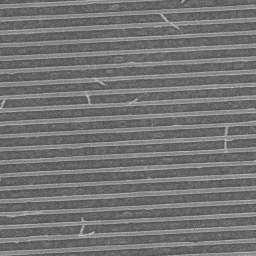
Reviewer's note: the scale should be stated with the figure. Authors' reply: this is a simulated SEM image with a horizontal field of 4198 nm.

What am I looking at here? parallel lines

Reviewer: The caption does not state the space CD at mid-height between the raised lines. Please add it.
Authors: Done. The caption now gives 156 nanometres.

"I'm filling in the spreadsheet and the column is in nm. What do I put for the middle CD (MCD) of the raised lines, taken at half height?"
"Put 57.3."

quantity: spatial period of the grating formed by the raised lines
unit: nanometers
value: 213